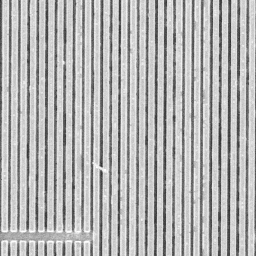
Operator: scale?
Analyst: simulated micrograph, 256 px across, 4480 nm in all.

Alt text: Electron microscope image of parallel lines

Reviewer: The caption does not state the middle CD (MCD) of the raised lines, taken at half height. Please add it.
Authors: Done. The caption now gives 94 nanometers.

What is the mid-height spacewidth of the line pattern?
63.4 nanometers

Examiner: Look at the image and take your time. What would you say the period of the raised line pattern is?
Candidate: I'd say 160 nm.